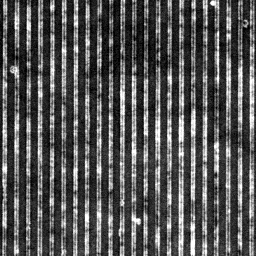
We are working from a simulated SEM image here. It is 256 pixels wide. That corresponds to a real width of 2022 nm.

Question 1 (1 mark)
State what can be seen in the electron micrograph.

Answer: parallel lines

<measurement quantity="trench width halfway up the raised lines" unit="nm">67.1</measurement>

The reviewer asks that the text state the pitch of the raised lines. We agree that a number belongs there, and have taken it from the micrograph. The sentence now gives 92.9 nm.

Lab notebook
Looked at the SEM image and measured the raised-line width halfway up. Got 22.7 nm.